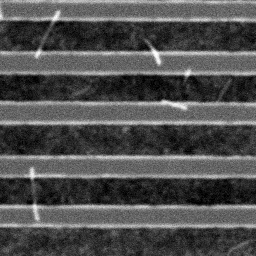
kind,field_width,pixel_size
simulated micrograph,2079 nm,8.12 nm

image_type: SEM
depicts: lines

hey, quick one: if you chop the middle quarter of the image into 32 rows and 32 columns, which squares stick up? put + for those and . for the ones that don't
++++++++++++++++++++++++++++++++
++++++++++++++++++++++++++++++++
....++++++++.........+..++.+++++
................................
................................
................................
................................
................................
................................
+.++....................+++.....
++++++++++++++++++++++++++++++++
++++++++++++++++++++++++++++++++
++++++++++++++++++++++++++++++++
++++++++++++++++++++++++++++++++
++++++++++++++++++++++++++++++++
................................
................................
................................
................................
................................
................................
................................
................................
++++++++++++++++++++++++++++++++
++++++++++++++++++++++++++++++++
++++++++++++++++++++++++++++++++
++++++++++++++++++++++++++++++++
++++++++++++++++++++++++++++++++
................................
................................
................................
................................